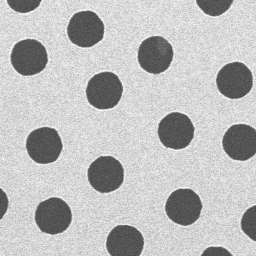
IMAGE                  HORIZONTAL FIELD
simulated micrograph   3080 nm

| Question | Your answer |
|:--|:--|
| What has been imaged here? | a regular array of holes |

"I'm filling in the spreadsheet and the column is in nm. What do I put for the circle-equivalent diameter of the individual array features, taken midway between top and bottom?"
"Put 450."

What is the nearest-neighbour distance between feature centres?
805 nanometres